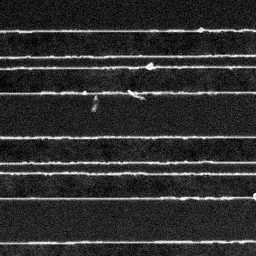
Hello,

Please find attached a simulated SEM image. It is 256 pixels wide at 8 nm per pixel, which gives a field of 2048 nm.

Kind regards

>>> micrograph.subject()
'lines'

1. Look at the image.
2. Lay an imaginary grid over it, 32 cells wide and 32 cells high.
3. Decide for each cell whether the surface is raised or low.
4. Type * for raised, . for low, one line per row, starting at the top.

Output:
********************************
********************************
********************************
********************************
................................
................................
................................
********************************
***************.****..*.....*...
................................
................................
................*...............
********************************
********************************
********************************
********************************
********************************
................................
................................
................................
********************************
********************************
................................
................................
...............................*
********************************
********************************
********************************
********************************
********************************
................................
................................